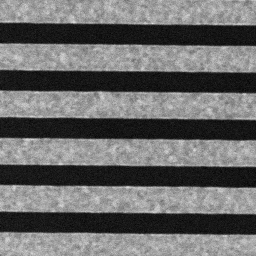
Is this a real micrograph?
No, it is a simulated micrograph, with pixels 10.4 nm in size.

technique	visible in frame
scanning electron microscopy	wiring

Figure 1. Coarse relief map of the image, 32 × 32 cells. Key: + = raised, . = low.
++++++++++++++++++++++++++++++++
++++++++++++++++++++++++++++++++
++++++++++++++++++++++++++++++++
................................
................................
................................
++++++++++++++++++++++++++++++++
++++++++++++++++++++++++++++++++
++++++++++++++++++++++++++++++++
................................
................................
++..............................
++++++++++++++++++++++++++++++++
++++++++++++++++++++++++++++++++
++++++++++++++++++++++++++++++++
................................
................................
+++++++++....++++...............
++++++++++++++++++++++++++++++++
++++++++++++++++++++++++++++++++
....++.+.+++++++++++++++++++++++
................................
................................
+++++++++++++++++++++++++.......
++++++++++++++++++++++++++++++++
++++++++++++++++++++++++++++++++
...........++..++.++++++++++++++
................................
................................
++++++++++++++++++++++++++++++++
++++++++++++++++++++++++++++++++
++++++++++++++++++++++++++++++++